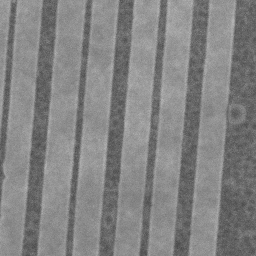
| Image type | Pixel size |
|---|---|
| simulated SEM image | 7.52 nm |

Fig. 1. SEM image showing parallel lines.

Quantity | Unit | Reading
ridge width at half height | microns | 0.184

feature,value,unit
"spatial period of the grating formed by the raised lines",38.3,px